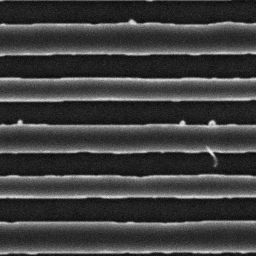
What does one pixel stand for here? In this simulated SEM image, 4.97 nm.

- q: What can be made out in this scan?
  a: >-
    lines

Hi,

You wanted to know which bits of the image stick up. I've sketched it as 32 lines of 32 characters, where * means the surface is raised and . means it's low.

................................
................................
................................
********************************
********************************
********************************
********************************
................................
................................
................................
********************************
********************************
*******************************.
................................
................................
................................
********************************
********************************
********************************
................................
................................
................................
********************************
********************************
********************************
................................
................................
................................
********************************
********************************
********************************
*******************.**...***..*.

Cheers